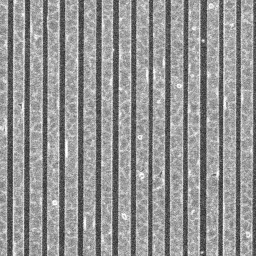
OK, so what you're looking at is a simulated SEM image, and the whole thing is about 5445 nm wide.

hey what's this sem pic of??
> parallel lines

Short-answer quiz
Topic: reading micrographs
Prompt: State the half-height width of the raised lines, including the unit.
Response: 0.245 µm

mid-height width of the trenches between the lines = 128 nm